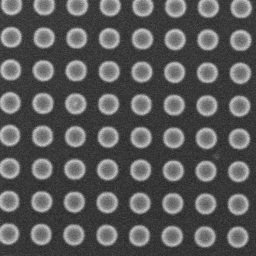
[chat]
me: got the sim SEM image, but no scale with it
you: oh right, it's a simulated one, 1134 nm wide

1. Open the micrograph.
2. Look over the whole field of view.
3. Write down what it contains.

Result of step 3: an array of small figures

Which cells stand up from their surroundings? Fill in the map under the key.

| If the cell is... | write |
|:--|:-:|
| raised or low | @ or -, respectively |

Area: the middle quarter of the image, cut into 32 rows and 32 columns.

-@@@@----@@@@-----@@@-----@@@---
-@@@@----@@@@@---@@@@@---@@@@@--
-@@@@----@@@@@---@@@@@---@@@@@--
-@@@@----@@@@-----@@@-----@@@@--
---------------------------@----
--------------------------------
--------------------------------
--------------------------------
-@@@@----@@@@----@@@@-----@@@---
@@@@@----@@@@----@@@@@---@@@@@--
@@@@@----@@@@@---@@@@@---@@@@@--
-@@@@----@@@@----@@@@----@@@@@--
-----------@-------@------@@@---
--------------------------------
--------------------------------
--------------------------------
-@@@@----@@@@-----@@@-----@@@---
-@@@@----@@@@----@@@@@---@@@@@--
-@@@@----@@@@@---@@@@@---@@@@@--
-@@@@----@@@@----@@@@----@@@@@--
--@-------@@------@@------@@@---
--------------------------------
--------------------------------
--------------------------------
-@@@-----@@@------@@@-----@@----
@@@@@----@@@@----@@@@----@@@@@--
@@@@@---@@@@@----@@@@@---@@@@@--
@@@@@----@@@@----@@@@----@@@@@--
-@@@-----@@@------@@@-----@@@---
--------------------------------
--------------------------------
--------------------------------